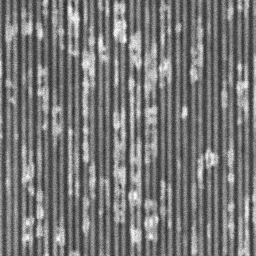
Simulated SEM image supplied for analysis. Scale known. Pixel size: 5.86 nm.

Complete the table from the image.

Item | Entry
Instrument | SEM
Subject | parallel lines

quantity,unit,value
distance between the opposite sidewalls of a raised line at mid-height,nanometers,20.5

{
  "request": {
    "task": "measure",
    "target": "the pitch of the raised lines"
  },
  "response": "0.0448 microns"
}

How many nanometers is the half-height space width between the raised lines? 30.7